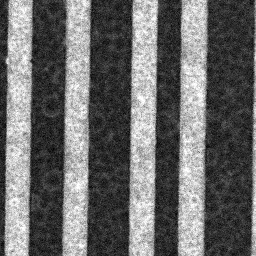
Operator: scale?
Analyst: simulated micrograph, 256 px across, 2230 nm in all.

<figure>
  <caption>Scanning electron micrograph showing parallel lines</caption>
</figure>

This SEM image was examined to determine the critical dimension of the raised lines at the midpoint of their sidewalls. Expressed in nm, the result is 207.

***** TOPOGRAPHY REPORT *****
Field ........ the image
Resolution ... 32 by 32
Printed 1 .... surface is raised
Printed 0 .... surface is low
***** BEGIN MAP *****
01110000111000000111000111000000
01110000111000000111000111000000
01110000111000000111000111000000
01110000111000000111000111000000
01110000111000000111000111000000
01110000111000000111000111000000
01110000111000000111000111000000
01110000111000000111000111000000
01110000111000000110000111000000
01110000111000000110000111000000
01110000111000000110000111000000
01110000111000001110000111000000
01110010111000001110000111000000
01110110111000001110000111000000
01110000111000001110000111000000
01110000111010001111000111000000
01110000111000001111100111000000
01110000111000001110000111000000
01110000111000001110000111000000
01110000111000001110000111100000
01110000111000001110000111000000
01110000111000001110000111000000
01110011111000001110000111000000
01110010111000001110001110000000
01110000111000001110001110000000
01111000111000001110001110000000
01111000111000001110001110000000
11111000111000001110001110000000
01110000111000001110001110000000
01110000111000001110001110000000
01110000111000001110001110000000
01110000111000001110001110000000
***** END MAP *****